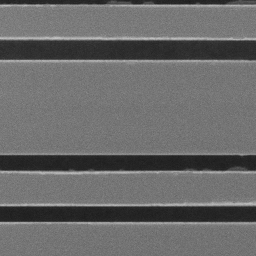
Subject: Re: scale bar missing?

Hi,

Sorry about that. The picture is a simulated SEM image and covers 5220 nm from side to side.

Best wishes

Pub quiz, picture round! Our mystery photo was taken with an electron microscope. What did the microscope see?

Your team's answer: lines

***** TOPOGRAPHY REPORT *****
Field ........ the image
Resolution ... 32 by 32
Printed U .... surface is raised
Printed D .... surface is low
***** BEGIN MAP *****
DDDDDDDDDDDDDDDDDDDDDDDDDDDDDDDD
UUUUUUUUUUUUUUUUUUUUUUUUUUUUUUUU
UUUUUUUUUUUUUUUUUUUUUUUUUUUUUUUU
UUUUUUUUUUUUUUUUUUUUUUUUUUUUUUUU
UUUUUUUUUUUUUUUUUUUUUUUUUUUUUUUU
DDDDDDDDDDDDDDDDDDDDDDDDDDDDDDDD
DDDDDDDDDDDDDDDDDDDDDDDDDDDDDDDD
DDDDDDDDDDDDDDDDDDDDDDDDDDDDDDDD
UUUUUUUUUUUUUUUUUUUUUUUUUUUUUUUU
UUUUUUUUUUUUUUUUUUUUUUUUUUUUUUUU
UUUUUUUUUUUUUUUUUUUUUUUUUUUUUUUU
UUUUUUUUUUUUUUUUUUUUUUUUUUUUUUUU
UUUUUUUUUUUUUUUUUUUUUUUUUUUUUUUU
UUUUUUUUUUUUUUUUUUUUUUUUUUUUUUUU
UUUUUUUUUUUUUUUUUUUUUUUUUUUUUUUU
UUUUUUUUUUUUUUUUUUUUUUUUUUUUUUUU
UUUUUUUUUUUUUUUUUUUUUUUUUUUUUUUU
UUUUUUUUUUUUUUUUUUUUUUUUUUUUUUUU
UUUUUUUUUUUUUUUUUUUUUUUUUUUUUUUU
DDDDDDDDDDDDDDDDDDDDDDDDDDDDDDDD
DDDDDDDDDDDDDDDDDDDDDDDDDDDDDDDD
UUUUUUUUUUUUUUUUUUUUUUUUUUUUUUUU
UUUUUUUUUUUUUUUUUUUUUUUUUUUUUUUU
UUUUUUUUUUUUUUUUUUUUUUUUUUUUUUUU
UUUUUUUUUUUUUUUUUUUUUUUUUUUUUUUU
UUUUUUUUUUUUUUUUUUUUUUUUUUUUUUUU
DDDDDDDDDDDDDDDDDDDDDDDDDDDDDDDD
DDDDDDDDDDDDDDDDDDDDDDDDDDDDDDDD
UUUUUUUUUUUUUUUUUUUUUUUUUUUUUUUU
UUUUUUUUUUUUUUUUUUUUUUUUUUUUUUUU
UUUUUUUUUUUUUUUUUUUUUUUUUUUUUUUU
UUUUUUUUUUUUUUUUUUUUUUUUUUUUUUUU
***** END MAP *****